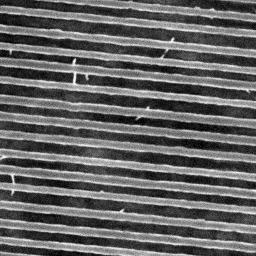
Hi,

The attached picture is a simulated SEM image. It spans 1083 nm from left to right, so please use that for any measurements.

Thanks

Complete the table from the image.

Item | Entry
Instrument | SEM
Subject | parallel lines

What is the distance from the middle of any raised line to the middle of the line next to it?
74.8 nm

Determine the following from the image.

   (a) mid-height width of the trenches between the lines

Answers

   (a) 42.6 nm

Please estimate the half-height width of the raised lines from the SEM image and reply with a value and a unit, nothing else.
0.0316 microns